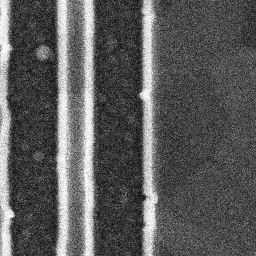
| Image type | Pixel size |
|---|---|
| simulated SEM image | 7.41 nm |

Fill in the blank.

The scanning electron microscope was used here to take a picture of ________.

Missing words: one or a few lines or trenches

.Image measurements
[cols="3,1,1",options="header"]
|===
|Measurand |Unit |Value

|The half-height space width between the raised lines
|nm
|426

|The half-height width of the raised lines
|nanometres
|199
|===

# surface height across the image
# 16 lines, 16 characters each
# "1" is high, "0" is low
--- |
0000110001111111
0000110001111111
0000110001111111
0000110001111111
0000110001111111
0000110001111111
0000110001111111
0000110001111111
0000110001111111
0000110001111111
0000100001111111
0000110001111111
0000110001111111
1000110001111111
0000110001111111
0000110001111111